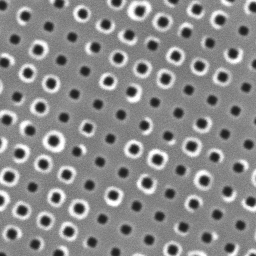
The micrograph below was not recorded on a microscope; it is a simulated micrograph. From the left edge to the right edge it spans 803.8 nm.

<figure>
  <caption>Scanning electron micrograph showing a regular array of holes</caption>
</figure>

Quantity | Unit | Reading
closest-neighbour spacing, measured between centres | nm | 79.4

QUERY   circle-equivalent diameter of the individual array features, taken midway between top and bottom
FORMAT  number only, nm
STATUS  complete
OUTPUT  32.5